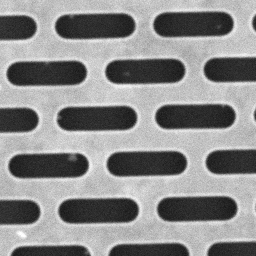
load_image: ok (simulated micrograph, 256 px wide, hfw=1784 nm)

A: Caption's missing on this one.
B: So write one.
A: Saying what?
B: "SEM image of groups of lines, slits or small figures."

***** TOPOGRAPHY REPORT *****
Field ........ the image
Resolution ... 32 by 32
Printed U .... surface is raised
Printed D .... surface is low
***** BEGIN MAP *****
UUUUUUUUUUUUUUUUUUUUUUUUUUUUUUUU
UUUUUUUUUUUUUUUUUUUUUDDDDDDDUUUU
DDDDUUUDDDDDDDDDDUUDDDDDDDDDDUUU
DDDDDUUDDDDDDDDDDUUDDDDDDDDDDUUU
DDDDUUUDDDDDDDDDUUUUDDDDDDDDUUUU
UUUUUUUUUUUUUUUUUUUUUUUUUUUUUUUU
UUUUUUUUUUUUUUUUUUUUUUUUUUUUUUUU
UUUUUUDDDUUUUUDDDDDDDDUUUUDDDDDD
UDDDDDDDDDDUUDDDDDDDDDDUUDDDDDDD
UDDDDDDDDDDUUDDDDDDDDDDUUUDDDDDD
UDDDDDDDDDUUUUDDDDDDDUUUUUUUUUUU
UUUUUUUUUUUUUUUUUUUUUUUUUUUUUUUU
UUUUUUUUUUUUUUUUUUUUUUUUUUUUUUUU
DDDUUUUUDDDDDDDDDUUUDDDDDDDDDUUU
DDDDDUUDDDDDDDDDDUUDDDDDDDDDDDUU
DDDDDUUDDDDDDDDDDUUUDDDDDDDDDUUU
DDDDUUUUUUUUUUUUUUUUUUUUUUUUUUUU
UUUUUUUUUUUUUUUUUUUUUUUUUUUUUUUU
UUUUUUUUUUUUUUUUUUUUUUUUUUUUUUUU
UUDDDDDDDDDUUUDDDDDDDDDUUUDDDDDD
UDDDDDDDDDDUUDDDDDDDDDDUUUDDDDDD
UDDDDDDDDDDUUUDDDDDDDDDUUUDDDDDD
UUUUUUUUUUUUUUUUUUUUUUUUUUUUUUUU
UUUUUUUUUUUUUUUUUUUUUUUUUUUUUUUU
UUUUUUUUUUUUUUUUUUUUUUUUUDDDUUUU
DDDDDUUUDDDDDDDDDUUUDDDDDDDDDDUU
DDDDDUUDDDDDDDDDDUUUDDDDDDDDDDUU
DDDDDUUUDDDDDDDDDUUUDDDDDDDDDUUU
UUUUUUUUUUUUUUUUUUUUUUUUUUUUUUUU
UUUUUUUUUUUUUUUUUUUUUUUUUUUUUUUU
UUUUUUUUUUUUUUUDDDDDDDDUUUUDDDDD
UDDDDDDDDDDUUUDDDDDDDDDDUUDDDDDD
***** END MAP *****